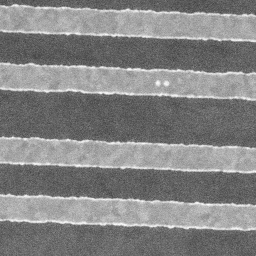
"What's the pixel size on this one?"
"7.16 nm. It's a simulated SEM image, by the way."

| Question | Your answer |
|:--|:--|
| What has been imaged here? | lines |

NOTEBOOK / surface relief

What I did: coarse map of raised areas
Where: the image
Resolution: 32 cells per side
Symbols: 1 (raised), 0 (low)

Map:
00000000000000000000000000000000
11111111111111111110000000000000
11111111111111111111111111111111
11111111111111111111111111111111
00000000000000011111111111111111
00000000000000000000000000000000
00000000000000000000000000000000
00000000000000000000000000000000
11111111111111000000000000000000
11111111111111111111111111111111
11111111111111111111111111111111
00000000001111111111111111111111
00000000000000000000000000000000
00000000000000000000000000000000
00000000000000000000000000000000
00000000000000000000000000000000
00000000000000000000000000000000
11111111100000000000000000000000
11111111111111111111111111111111
11111111111111111111111111111111
00001111111111111111111111111111
00000000000000000000000000000011
00000000000000000000000000000000
00000000000000000000000000000000
11011100000000000000000000000000
11111111111111111111111111000000
11111111111111111111111111111111
11111111111111111111111111111111
00000000000000000000000111111111
00000000000000000000000000000000
00000000000000000000000000000000
00000000000000000000000000000000